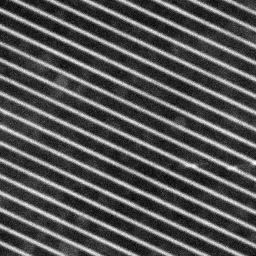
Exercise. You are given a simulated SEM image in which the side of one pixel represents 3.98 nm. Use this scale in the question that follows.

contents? parallel lines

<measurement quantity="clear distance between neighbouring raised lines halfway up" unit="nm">53.6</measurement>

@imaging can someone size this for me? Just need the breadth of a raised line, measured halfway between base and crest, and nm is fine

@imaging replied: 5.8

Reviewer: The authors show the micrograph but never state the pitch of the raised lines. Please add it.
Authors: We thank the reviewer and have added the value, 59.9 nanometers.